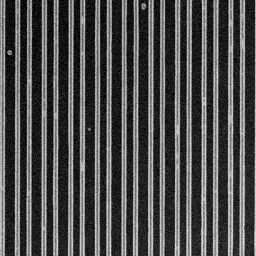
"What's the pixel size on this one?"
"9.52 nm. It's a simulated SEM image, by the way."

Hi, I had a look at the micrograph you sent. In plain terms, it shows parallel lines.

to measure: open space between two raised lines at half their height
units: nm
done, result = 105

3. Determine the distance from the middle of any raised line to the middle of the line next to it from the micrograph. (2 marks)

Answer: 0.127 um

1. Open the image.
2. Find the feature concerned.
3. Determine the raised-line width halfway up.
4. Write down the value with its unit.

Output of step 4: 34.5 nanometres